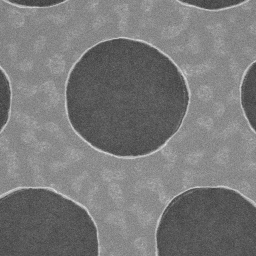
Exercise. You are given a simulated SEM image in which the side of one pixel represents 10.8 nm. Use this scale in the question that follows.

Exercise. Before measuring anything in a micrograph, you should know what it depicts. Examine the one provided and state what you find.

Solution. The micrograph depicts holes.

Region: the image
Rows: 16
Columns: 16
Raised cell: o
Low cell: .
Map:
ooooooooooooo.oo
oooooooooooooooo
ooooooo.oooooooo
ooooo.....oooooo
oooo.......oooo.
.ooo........ooo.
.ooo........ooo.
oooo.......oooo.
ooooo......ooooo
ooooooo...oooooo
oooooooooooooooo
oooooooooooooooo
....ooooooo.....
......oooo......
......oooo......
......oooo......